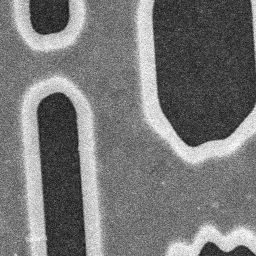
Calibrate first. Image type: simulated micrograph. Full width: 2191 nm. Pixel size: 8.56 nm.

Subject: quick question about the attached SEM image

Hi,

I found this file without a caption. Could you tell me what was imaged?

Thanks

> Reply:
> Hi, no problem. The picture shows one or a few lines or trenches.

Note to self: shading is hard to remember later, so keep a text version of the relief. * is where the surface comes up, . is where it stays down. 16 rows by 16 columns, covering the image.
*....****.......
**...****.......
**..*****.......
*********.......
*********.......
***.*****.......
**...****.......
**...*****......
**...******....*
**...*******.***
**...***********
**....**********
**....**********
**....**********
**....**********
**....******....